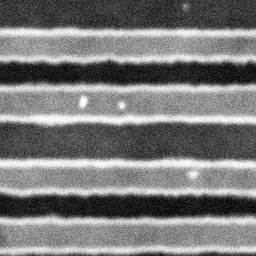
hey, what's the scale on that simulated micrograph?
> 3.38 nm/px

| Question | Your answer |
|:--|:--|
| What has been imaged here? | lines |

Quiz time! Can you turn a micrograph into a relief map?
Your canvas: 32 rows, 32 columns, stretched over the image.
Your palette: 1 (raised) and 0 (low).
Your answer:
00000000000000000000000000000000
00000000000000000000000000000000
00000000000000000000000000000000
00000000000000000000000000000000
11111111111111111111111111111111
11111111111111111111111111111111
11111111111111111111111111111111
10111011011100011110000001000100
00000000000000000000000000000000
00000000000000000000000000000000
00000000000000000000000000000000
11111111111111111111111111111111
11111111111111111111111111111111
11111111111111111111111111111111
11111111111111111111111111111111
00000000000000000000000000000000
00000000000000000000000000000000
00000000000000000000000000000000
00000000000000000000000000000000
00000000000000000000000000000000
11111111111111111101111111011100
11111111111111111111111111111111
11111111111111111111111111111111
11111111111111111111111111111111
00000000000000000000000000000000
00000000000000000000000000000000
00000000000000000000000000000000
10000010000000000000000001100011
11111111111111111111111111111111
11111111111111111111111111111111
11111111111111111111111111111111
00000000000100000000000000000000